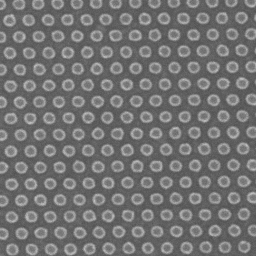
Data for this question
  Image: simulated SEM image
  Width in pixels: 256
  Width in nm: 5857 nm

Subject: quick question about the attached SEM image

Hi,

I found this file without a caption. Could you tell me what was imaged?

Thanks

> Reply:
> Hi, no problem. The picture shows a regular array of raised bodies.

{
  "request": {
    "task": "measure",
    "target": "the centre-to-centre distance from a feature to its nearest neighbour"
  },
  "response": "0.43 µm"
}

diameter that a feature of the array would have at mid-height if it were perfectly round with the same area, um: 0.252